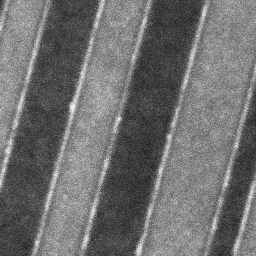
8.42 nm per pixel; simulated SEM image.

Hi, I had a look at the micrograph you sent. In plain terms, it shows one or a few lines or trenches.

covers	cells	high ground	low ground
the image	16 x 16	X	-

---XXX---XXXX---
---XXX---XXXX---
--XXXX---XXX----
--XXXX--XXXX----
--XXX---XXXX----
-XXXX---XXXX----
-XXXX---XXX----X
-XXX---XXXX----X
-XXX---XXXX----X
XXXX---XXX-----X
XXXX--XXXX----XX
XXX---XXXX----XX
XXX---XXXX----XX
XXX---XXX----XX-
XXX--XXXX----XX-
XX---XXXX----XX-